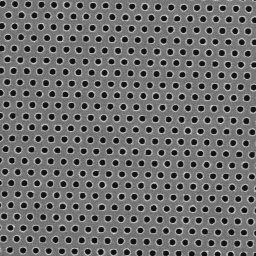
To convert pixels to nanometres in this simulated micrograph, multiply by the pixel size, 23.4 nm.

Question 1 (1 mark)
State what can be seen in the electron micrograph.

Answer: a regular array of holes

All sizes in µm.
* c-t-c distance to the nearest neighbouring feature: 0.295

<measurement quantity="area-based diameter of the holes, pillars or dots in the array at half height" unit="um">0.147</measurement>